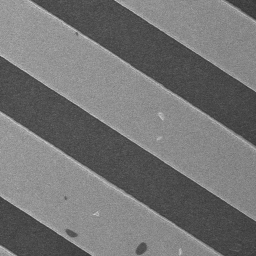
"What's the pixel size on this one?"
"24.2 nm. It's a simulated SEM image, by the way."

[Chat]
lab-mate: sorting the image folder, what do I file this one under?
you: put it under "lines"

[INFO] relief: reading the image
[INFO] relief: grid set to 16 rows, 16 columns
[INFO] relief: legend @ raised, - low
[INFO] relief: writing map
@@@-----@@@@@@@-
@@@@-----@@@@@@@
@@@@@@-----@@@@@
@@@@@@@------@@@
--@@@@@@@-----@@
---@@@@@@@------
-----@@@@@@@----
@-----@@@@@@@---
@@------@@@@@@@-
@@@@-----@@@@@@@
@@@@@------@@@@@
@@@@@@@-----@@@@
@@@@@@@@@-----@@
--@@@@@@@@-----@
---@@@@@@@@@----
-----@@@@@@@@---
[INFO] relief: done